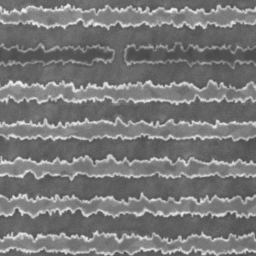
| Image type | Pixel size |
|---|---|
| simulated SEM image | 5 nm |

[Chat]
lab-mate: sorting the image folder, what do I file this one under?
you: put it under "parallel lines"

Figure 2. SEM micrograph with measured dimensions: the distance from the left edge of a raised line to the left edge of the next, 37.8 px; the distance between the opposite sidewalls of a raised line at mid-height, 77.4 nm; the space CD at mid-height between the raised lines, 110 nanometers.